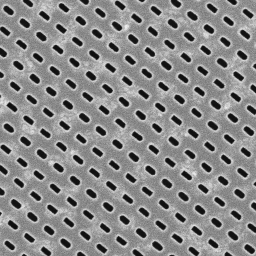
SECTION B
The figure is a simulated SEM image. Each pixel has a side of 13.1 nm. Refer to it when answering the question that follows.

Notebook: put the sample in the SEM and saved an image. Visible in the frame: a regular array of holes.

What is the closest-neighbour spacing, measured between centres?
272 nm